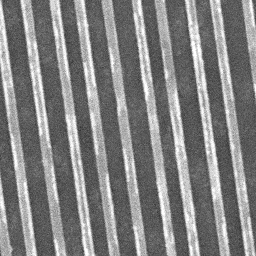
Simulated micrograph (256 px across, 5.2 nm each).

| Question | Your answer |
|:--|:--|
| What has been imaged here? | parallel lines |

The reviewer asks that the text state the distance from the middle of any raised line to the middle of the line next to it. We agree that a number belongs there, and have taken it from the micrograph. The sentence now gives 141 nm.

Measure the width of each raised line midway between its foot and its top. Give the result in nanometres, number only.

49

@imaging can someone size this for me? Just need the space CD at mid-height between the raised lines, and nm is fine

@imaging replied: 97.8